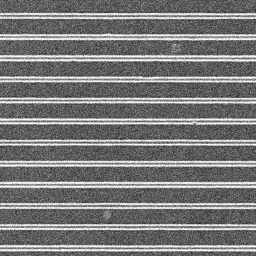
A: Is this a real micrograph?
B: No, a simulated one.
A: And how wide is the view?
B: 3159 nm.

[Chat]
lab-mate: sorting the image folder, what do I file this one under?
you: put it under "parallel lines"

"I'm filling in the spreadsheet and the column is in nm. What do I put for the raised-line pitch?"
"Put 260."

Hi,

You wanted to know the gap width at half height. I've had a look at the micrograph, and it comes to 216 nanometres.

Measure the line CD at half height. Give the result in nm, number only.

47.8